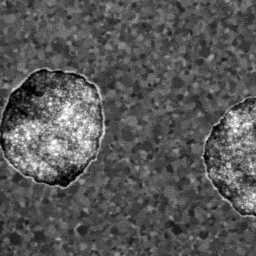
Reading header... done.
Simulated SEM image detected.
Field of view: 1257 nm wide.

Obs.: holes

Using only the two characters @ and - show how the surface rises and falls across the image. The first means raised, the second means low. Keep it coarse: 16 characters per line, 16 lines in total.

@@@@@@@@@@@@@@@@
@@@@@@@@@@@@@@@@
@@@@@@@@@@@@@@@@
@@@@@@@@@@@@@@@@
@@--@@@@@@@@@@@@
@-----@@@@@@@@@@
------@@@@@@@@@-
------@@@@@@@@--
------@@@@@@@---
------@@@@@@@---
@----@@@@@@@@---
@@@-@@@@@@@@@---
@@@@@@@@@@@@@@--
@@@@@@@@@@@@@@@@
@@@@@@@@@@@@@@@@
@@@@@@@@@@@@@@@@